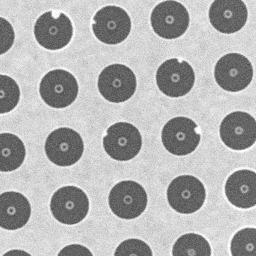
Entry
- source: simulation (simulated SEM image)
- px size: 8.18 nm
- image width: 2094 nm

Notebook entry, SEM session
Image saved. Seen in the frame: an array of small figures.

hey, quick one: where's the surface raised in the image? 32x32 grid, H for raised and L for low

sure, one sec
HHHHHHHHHHHHHHHHHHHHLLLHHHLLLLLH
HHHHHHHHHHHHLLLLHHHLLLLLHHLLLLLH
LHHHHLLLLHHLLLLLHHHLLLLLHHLLLLLH
LLHHLLLLLHHLLLLLHHHLLLLHHHHLLLHH
LLHHLLLLLHHHLLLLHHHHLLLHHHHHHHHH
LLHHHLLLLHHHHLLHHHHHHHHHHHHHHHHH
LHHHHHHHHHHHHHHHHHHHHHHHHHHHHHHH
HHHHHHHHHHHHHHHHHHHHHLLHHHHLLLLH
HHHHHHHHHHHHHLLLHHHHLLLLHHHLLLLL
LHHHHLLLLHHHLLLLLHHLLLLLHHHLLLLL
LLHHHLLLLLHHLLHLLHHHLLLLHHHLLLLH
LLLHHLLLLLHHLLLLLHHHLLLLHHHHHLHH
LLHHHLLLLHHHHLLLHHHHHHHHHHHHHHHH
LLHHHHHLHHHHHHHHHHHHHHHHHHHHHHHH
HHHHHHHHHHHHHHHHHHHHHHHHHHHHLLLL
HHHHHHHHHHHHHHLLHHHHHLLLLHHHLLLL
HHHHHHLLLLHHHLLLLLHHLLLLLHHLLLLL
LLLHHHLLLLHHHLLHLLHHLLLLLHHHLLLL
LLLHHHLLLLLHHLLLLLHHHLLLLHHHHLLH
LLLHHHLLLLHHHHLLLHHHHHLHHHHHHHHH
LLLHHHHLLHHHHHHHHHHHHHHHHHHHHHHH
LHHHHHHHHHHHHHHHHHHHHHHHHHHHHLLL
HHHHHHHHHHHHHHHHHHHHHHLLLHHHLLLL
HHHHHHHLLLHHHHLLLLHHHLLLLLHHLLLL
LLLHHHLLLLLHHHLLLLHHHLLLLLHHLLLL
LLLLHHLLLLLHHHLLLLHHHLLLLHHHHLLL
LLLLHHLLLLLHHHLLLLHHHHLLHHHHHHHH
LLLLHHHLLLHHHHHHHHHHHHHHHHHHHHHH
LLLHHHHHHHHHHHHHHHHHHHHHHHHHHHLL
HHHHHHHHHHHHHHHHHHHHHHHLLHHHHLLL
HHHHHHHHHLHHHHHLLLHHHHLLLLHHHLLL
HLLHHHHLLLLHHHLLLLLHHLLLLLHHHLLL